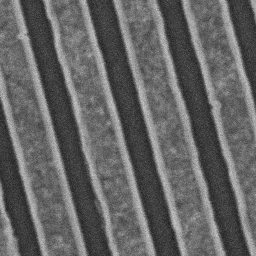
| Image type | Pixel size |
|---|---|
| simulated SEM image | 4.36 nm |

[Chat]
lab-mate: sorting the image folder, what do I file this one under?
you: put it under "one or a few lines or trenches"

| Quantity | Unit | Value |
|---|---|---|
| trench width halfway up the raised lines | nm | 133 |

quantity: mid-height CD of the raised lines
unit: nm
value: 157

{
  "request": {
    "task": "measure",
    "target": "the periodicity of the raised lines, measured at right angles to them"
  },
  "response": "291 nm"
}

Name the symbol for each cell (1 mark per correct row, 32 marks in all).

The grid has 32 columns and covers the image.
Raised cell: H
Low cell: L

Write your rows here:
HHLLLLHHHHHLLLLHHHHLLLLHHHHHLLLL
HHLLLLHHHHHLLLLHHHHHLLLHHHHHLLLL
HHHLLLLHHHHLLLLHHHHHLLLLHHHHLLLL
HHHLLLLHHHHLLLLHHHHHLLLLHHHHHLLL
HHHLLLLHHHHHLLLLHHHHLLLLHHHHHLLL
HHHLLLLHHHHHLLLLHHHHHLLLLHHHHLLL
HHHHLLLHHHHHLLLLHHHHHLLLLHHHHHLL
HHHHLLLLHHHHLLLLLHHHHLLLLHHHHHLL
HHHHLLLLHHHHHLLLLHHHHLLLLHHHHHLL
HHHHHLLLHHHHHLLLLHHHHHLLLLHHHHLL
HHHHHLLLLHHHHLLLLHHHHHLLLLHHHHHL
HHHHHLLLLHHHHLLLLLHHHHLLLLHHHHHL
LHHHHLLLLHHHHHLLLLHHHHLLLLLHHHHL
LHHHHHLLLLHHHHLLLLHHHHHLLLLHHHHL
LHHHHHLLLLHHHHLLLLHHHHHLLLLHHHHH
LHHHHHLLLLHHHHHLLLLHHHHLLLLHHHHH
LLHHHHLLLLHHHHHLLLLHHHHHLLLLHHHH
LLHHHHHLLLLHHHHLLLLHHHHHLLLLHHHH
LLHHHHHLLLLHHHHLLLLHHHHHLLLLHHHH
LLHHHHHLLLLHHHHHLLLLHHHHLLLLHHHH
LLLHHHHLLLLHHHHHLLLLHHHHLLLLLHHH
LLLHHHHHLLLLHHHHLLLLHHHHHLLLLHHH
LLLHHHHHLLLLHHHHLLLLLHHHHLLLLHHH
LLLHHHHHLLLLHHHHHLLLLHHHHLLLLLHH
LLLLHHHHLLLLLHHHHLLLLHHHHHLLLLHH
LLLLHHHHHLLLLHHHHLLLLHHHHHLLLLHH
LLLLHHHHHLLLLHHHHHLLLLHHHHLLLLHH
HLLLHHHHHLLLLHHHHHLLLLHHHHLLLLHH
HLLLLHHHHHLLLLHHHHLLLLHHHHHLLLLH
HLLLLHHHHHLLLLHHHHLLLLHHHHHLLLLH
HLLLLHHHHHLLLLHHHHHLLLLHHHHLLLLH
HHLLLLHHHHLLLLHHHHHLLLLHHHHHLLLL